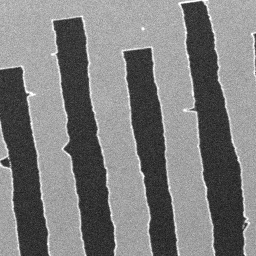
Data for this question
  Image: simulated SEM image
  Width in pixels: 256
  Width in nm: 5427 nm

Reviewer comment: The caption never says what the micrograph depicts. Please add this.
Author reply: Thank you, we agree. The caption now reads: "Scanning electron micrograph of one or a few lines or trenches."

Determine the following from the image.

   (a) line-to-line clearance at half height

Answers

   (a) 737 nm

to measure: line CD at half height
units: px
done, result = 30.6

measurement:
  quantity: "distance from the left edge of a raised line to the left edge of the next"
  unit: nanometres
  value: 1380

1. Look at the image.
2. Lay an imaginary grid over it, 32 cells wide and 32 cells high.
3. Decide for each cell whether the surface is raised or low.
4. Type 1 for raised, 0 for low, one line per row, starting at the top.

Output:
00000000000000000000000111000000
00000000000000000000000111000000
00000001110000000000000111000000
00000001111000000000000111100000
00000001111000000000000111100000
00000001111000000000000111100000
00000001111000001110000111100000
00000001111000001110000011100000
01100001111000001110000011100000
11100001111000001110000011100000
11100000111000001111000011110000
11110000111000001111000011110000
11100000111000001111000011110000
11110000111100001111000011110000
11110000111100001111000001111000
11110000111100001111000001111000
11110000111100000111100001111000
11110000011100000111100001111000
01110000111110000111100001111000
01111000011110000111100001111100
11111000011110000111100001111100
01111000011110000011100001111100
00111000011110000011100001111100
00111000011111000011100000111100
00111000001111000011100000111100
00111000001111000011110000111110
00111100001111000001110000111110
00111100001111000001110000111110
00111100001111000001110000011110
00111100001111000001110000011110
00111100001111100001110000011110
00111100000111000001110000011110